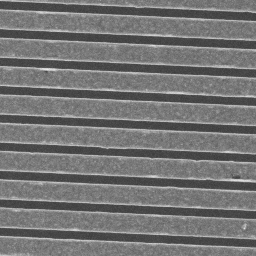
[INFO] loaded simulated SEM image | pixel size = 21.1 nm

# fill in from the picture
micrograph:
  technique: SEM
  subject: parallel lines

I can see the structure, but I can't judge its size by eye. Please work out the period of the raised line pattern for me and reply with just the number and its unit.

28.2 px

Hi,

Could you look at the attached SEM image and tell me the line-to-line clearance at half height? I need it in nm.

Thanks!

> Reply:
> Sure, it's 177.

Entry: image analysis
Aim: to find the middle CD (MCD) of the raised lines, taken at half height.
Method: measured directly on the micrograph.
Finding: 415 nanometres